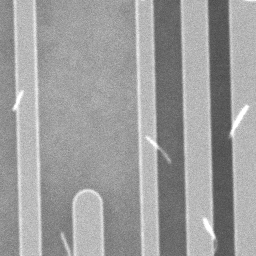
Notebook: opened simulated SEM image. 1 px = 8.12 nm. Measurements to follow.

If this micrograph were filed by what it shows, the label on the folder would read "groups of lines, slits or small figures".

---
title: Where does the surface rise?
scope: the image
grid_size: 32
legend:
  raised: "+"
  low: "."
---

..++.............++....+++...+++
..++.............++....+++...+++
..++.............++....+++...+++
..++.............++....+++...+++
..++.............++....+++...+++
..++.............++....+++...+++
..++.............++....+++...+++
..++.............++....+++...+++
..++.............++....+++...+++
..++.............++....+++...+++
..+++............++....+++...+++
..+++............++....+++...+++
..+++............++....+++...+++
..+++............++....+++...+++
..+++............++....+++...+++
..+++............++....+++...+++
..+++............++....+++...+++
..+++.............+....+++...+++
..+++.............++...+++...+++
..+++.............++...+++...+++
..+++.............++...+++...+++
..+++.............++...+++...+++
..+++.............++...+++...+++
..+++.............++...+++...+++
..+++.....++......++...+++...+++
..+++....++++.....++...+++...+++
..+++....++++.....++...+++...+++
..+++....++++.....++...+++...+++
..+++....++++.....++...++++..+++
...++....++++.....++...++++..+++
...++....++++.....++...++++..+++
...++....++++.....++...++++..+++